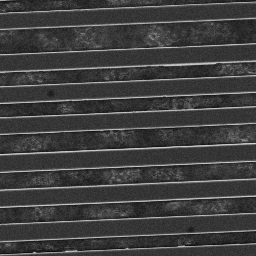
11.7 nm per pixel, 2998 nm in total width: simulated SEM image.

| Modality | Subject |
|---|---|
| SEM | parallel lines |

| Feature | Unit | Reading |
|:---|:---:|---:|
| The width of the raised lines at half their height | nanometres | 202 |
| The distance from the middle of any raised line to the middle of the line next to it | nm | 413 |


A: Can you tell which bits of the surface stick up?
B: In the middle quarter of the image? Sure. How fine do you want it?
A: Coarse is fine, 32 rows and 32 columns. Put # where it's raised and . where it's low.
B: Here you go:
####################............
................................
................................
................................
...........#####################
################################
################################
################################
############....#...............
................................
................................
..............................##
.......#########################
################################
################################
################################
#########.......................
................................
................................
................................
................................
.........#######################
################################
################################
################################
######################..........
................................
................................
................................
................................
...........#####################
################################